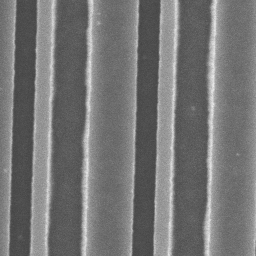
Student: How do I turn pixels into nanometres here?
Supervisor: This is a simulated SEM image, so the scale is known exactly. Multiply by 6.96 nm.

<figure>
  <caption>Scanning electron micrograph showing lines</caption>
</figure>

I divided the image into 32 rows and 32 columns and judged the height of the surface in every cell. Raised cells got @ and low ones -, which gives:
@@---@@----@@@@@@---@@-----@@@@@
@@---@@----@@@@@@---@@-----@@@@@
@@---@@----@@@@@@---@@-----@@@@@
@@---@@----@@@@@@---@@-----@@@@@
@@---@@----@@@@@@---@@-----@@@@@
@@---@@----@@@@@@---@@-----@@@@@
@@---@@----@@@@@@---@@-----@@@@@
@@---@-----@@@@@@---@@-----@@@@@
@@---@-----@@@@@@---@@-----@@@@@
@@---@-----@@@@@@---@@-----@@@@@
@@--@@-----@@@@@@---@@-----@@@@@
@@--@@-----@@@@@@---@@-----@@@@@
@@--@@-----@@@@@@---@@----@@@@@@
@@--@@-----@@@@@@---@@----@@@@@@
@@--@@-----@@@@@@---@@----@@@@@@
@@--@@-----@@@@@@---@@----@@@@@@
@---@@-----@@@@@@---@@----@@@@@@
@---@@-----@@@@@@---@@----@@@@@@
@---@@-----@@@@@@---@-----@@@@@@
@---@@-----@@@@@@---@-----@@@@@@
@---@@-----@@@@@@---@-----@@@@@@
@---@@-----@@@@@@--@@-----@@@@@@
@---@@-----@@@@@@--@@-----@@@@@@
@---@@-----@@@@@@--@@-----@@@@@@
@---@@-----@@@@@@--@@-----@@@@@@
@---@@-----@@@@@@--@@-----@@@@@@
@---@@-----@@@@@@--@@-----@@@@@@
@---@@-----@@@@@@--@@-----@@@@@@
@---@@-----@@@@@@--@@-----@@@@@@
@---@@-----@@@@@@--@@-----@@@@@@
@---@@-----@@@@@---@@-----@@@@@@
@---@@-----@@@@@---@@-----@@@@@@